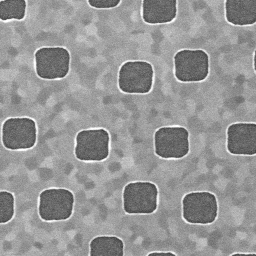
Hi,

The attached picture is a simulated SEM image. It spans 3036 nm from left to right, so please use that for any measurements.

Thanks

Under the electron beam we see a regular array of holes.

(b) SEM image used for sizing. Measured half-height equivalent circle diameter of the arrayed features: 422 nm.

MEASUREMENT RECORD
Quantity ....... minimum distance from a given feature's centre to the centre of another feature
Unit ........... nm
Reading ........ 759